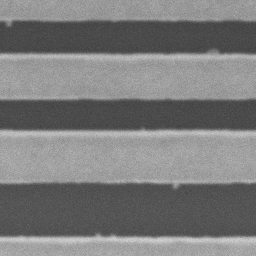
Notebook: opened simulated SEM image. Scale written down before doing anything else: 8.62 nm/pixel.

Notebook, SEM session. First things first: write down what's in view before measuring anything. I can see lines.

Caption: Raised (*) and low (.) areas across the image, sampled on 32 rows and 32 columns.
********************************
********************************
.....******.............****..**
................................
................................
................................
................................
********************************
********************************
********************************
********************************
********************************
................................
................................
................................
................................
*..................**********...
********************************
********************************
********************************
********************************
********************************
********************************
................................
................................
................................
................................
................................
................................
................................
********************************
********************************